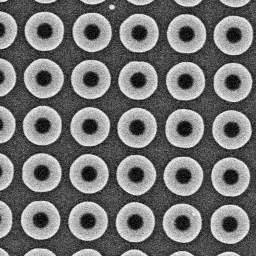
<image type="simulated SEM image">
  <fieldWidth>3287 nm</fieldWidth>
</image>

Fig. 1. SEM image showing an array of small figures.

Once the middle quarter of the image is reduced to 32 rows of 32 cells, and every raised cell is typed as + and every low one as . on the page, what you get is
...+++++++.....+++++++......++++
..+++++++++....++++++++....+++++
..+++++++++...+++++++++...++++++
..+++++++++...+++++++++...++++++
..+++++++++...+++++++++...++++++
..+++++++++...+++++++++...++++++
...++++++++...+++++++++...++++++
...+++++++.....+++++++.....+++++
.....+++.........++++.......++++
................................
................................
....+++++........+++........+++.
...+++++++.....+++++++.....+++++
..+++++++++...+++++++++...++++++
..+++++++++...+++++++++...++++++
..+++++++++..++++++++++...++++++
..+++++++++..++++++++++..+++++++
..+++++++++...+++++++++..+++++++
...+++++++....++++++++....++++++
...++++++......+++++++....++++++
................++++........++++
................................
................................
...++++++......+++++........++++
..++++++++....++++++++....++++++
..+++++++++...++++++++....++++++
..+++++++++..++++++++++..+++++++
..+++++++++..++++++++++..+++++++
..+++++++++..++++++++++..+++++++
..+++++++++...++++++++...+++++++
..++++++++....++++++++....++++++
....+++++......++++++......+++++